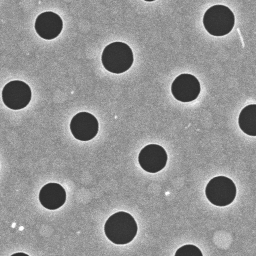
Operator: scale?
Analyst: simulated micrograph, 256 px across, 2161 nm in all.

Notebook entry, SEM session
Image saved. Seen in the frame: a regular array of holes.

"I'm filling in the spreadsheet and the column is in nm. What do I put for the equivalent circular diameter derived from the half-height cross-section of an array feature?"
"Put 248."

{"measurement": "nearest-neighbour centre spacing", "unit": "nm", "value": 635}